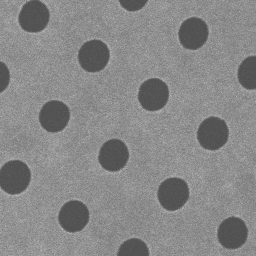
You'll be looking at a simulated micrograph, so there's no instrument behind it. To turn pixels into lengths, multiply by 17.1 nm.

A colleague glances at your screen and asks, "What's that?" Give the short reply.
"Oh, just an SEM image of a regular array of holes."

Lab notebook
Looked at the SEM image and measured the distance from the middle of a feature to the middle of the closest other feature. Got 1210 nm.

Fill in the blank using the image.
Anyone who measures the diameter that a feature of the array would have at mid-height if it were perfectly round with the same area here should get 554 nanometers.